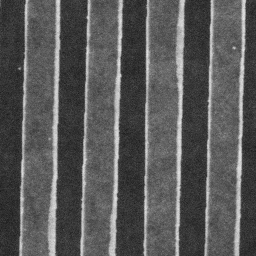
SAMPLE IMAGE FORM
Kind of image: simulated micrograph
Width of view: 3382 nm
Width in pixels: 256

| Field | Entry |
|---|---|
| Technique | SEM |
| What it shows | lines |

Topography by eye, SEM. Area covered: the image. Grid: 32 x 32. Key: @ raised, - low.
---@@@@----@@@@---@@@@@---@@@@@-
---@@@@----@@@@---@@@@@---@@@@--
---@@@@----@@@@---@@@@@---@@@@--
---@@@@----@@@@---@@@@@---@@@@--
---@@@@----@@@@---@@@@@---@@@@--
---@@@@----@@@@---@@@@@---@@@@--
---@@@@----@@@@---@@@@----@@@@--
---@@@@----@@@@---@@@@----@@@@--
---@@@@----@@@@---@@@@----@@@@--
---@@@@----@@@@---@@@@@---@@@@--
---@@@@----@@@@---@@@@@---@@@@--
---@@@@----@@@@---@@@@@---@@@@--
---@@@@----@@@@---@@@@@---@@@@--
---@@@@----@@@@---@@@@@---@@@@--
---@@@@----@@@@---@@@@@---@@@@--
---@@@@----@@@@---@@@@----@@@@--
---@@@@----@@@@---@@@@----@@@@--
---@@@@----@@@@---@@@@----@@@@--
---@@@@---@@@@@---@@@@----@@@@--
---@@@@---@@@@@---@@@@----@@@@--
---@@@@---@@@@@---@@@@----@@@@--
---@@@@---@@@@@---@@@@----@@@@--
---@@@@---@@@@@---@@@@----@@@@--
---@@@@---@@@@@---@@@@----@@@@--
---@@@@---@@@@----@@@@----@@@@--
---@@@@---@@@@----@@@@----@@@@--
---@@@@---@@@@----@@@@----@@@@--
---@@@@---@@@@----@@@@----@@@@--
---@@@@---@@@@----@@@@----@@@@--
---@@@@---@@@@----@@@@----@@@@--
---@@@@---@@@@----@@@@----@@@@--
---@@@@---@@@@----@@@@----@@@@--